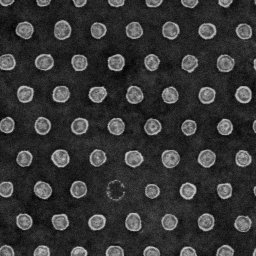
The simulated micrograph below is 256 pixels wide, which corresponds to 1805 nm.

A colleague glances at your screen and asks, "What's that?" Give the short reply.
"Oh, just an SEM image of a regular array of raised bodies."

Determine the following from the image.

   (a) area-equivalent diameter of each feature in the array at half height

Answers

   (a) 110 nanometers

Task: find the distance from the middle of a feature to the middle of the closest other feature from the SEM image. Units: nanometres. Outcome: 253